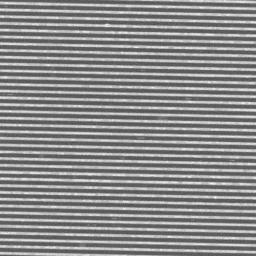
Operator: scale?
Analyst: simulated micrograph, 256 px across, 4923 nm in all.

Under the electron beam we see parallel lines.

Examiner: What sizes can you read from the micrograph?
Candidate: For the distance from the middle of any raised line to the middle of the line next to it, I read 0.13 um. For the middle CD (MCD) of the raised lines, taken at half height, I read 33.6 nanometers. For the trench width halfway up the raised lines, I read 84.1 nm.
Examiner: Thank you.